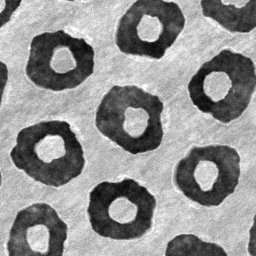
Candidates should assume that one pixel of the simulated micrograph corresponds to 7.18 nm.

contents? ring-shaped grooves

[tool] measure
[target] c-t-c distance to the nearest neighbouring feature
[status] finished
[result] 653 nm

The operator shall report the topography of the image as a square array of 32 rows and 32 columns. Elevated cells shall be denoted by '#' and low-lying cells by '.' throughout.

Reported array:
#..##############.....###...###.
..##############.......##.......
.##############...##...####.....
###############..###...#####....
#####....#####...###..##########
####.......###........##########
####...##...###......######..###
###...###...##############.....#
.##....##...#############.......
.##........#############..##....
.###......##############.####...
#############.....######..##....
#############.......####.......#
############........#####......#
############....###.######....##
####.....###....##..############
##.......###....##..############
##...###..####......############
##...###..#####.....####.....###
#....###...############.......##
##.........###########...##...##
###.......############..###...##
####.....######..#####...##...##
############......####...#...###
###########........####......###
####..#####...###...#####...####
##.....####...###..#############
##......###...##...#############
#...##..####.......############.
#..###..#####.....####...######.
#...##..#############......####.
#....#..#############.......###.